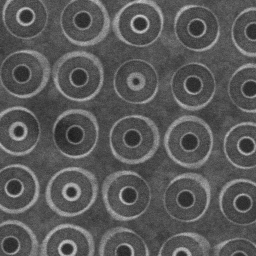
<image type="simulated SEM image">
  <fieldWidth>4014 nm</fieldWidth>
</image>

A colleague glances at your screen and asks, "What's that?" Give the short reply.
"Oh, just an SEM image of an array of small figures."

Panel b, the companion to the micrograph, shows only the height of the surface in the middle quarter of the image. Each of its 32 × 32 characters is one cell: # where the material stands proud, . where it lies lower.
.........#####........########..
..###....####..........######...
..####...####..........#####....
..####....###....##....####....#
..####...####...####...####...##
...#.....####....##....####...##
........#####..........####....#
........######.........####.....
##.....########.......######....
#################...#########...
##############################..
################################
......##########################
.......########.....###########.
........#####........#######....
..##....####..........#####.....
.####...####....##.....###......
.####...####...####....###....##
.####...####...####....###...###
.###....####...####....##....###
........####....##.....###...###
.......#####...........###....##
......#######.........####......
##############.......######.....
################..##########....
###############################.
....############################
......#######....###############
.......#####.......#########....
........###.........#######.....
.##.....##...........#####......
####....##....####...#####......